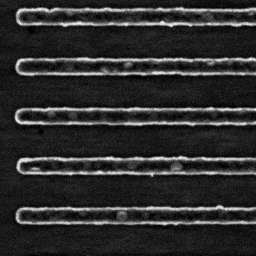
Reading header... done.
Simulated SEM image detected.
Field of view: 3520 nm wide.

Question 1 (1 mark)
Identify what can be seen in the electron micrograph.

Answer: parallel lines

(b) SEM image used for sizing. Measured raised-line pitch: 683 nm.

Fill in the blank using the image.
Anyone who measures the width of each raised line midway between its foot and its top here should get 15.6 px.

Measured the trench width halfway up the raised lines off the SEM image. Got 462 nanometers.